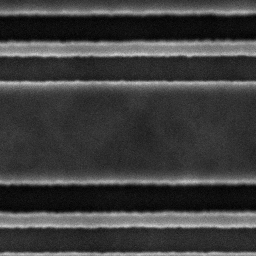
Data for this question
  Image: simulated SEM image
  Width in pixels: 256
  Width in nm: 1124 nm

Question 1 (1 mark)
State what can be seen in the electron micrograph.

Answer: lines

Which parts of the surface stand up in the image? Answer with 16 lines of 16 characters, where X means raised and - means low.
XXXXXXXXXXXXXXXX
----------------
----------------
XXXXXXXXXXXXXXXX
XXXXXXXXXXXXXXXX
XXXXXXXXXXXXXXXX
XXXXXXXXXXXXXXXX
XXXXXXXXXXXXXXXX
XXXXXXXXXXXXXXXX
XXXXXXXXXXXXXXXX
XXXXXXXXXXXXXXXX
----------------
----------------
XXXXXXXXXXXXXXXX
XXXXXXXXXXXXXXXX
XXXXXXXXXXXXXXXX